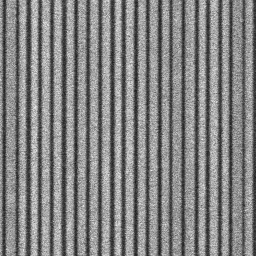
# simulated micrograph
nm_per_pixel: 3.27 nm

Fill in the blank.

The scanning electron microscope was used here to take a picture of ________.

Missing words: parallel lines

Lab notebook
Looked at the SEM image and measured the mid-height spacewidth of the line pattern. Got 12.3 nm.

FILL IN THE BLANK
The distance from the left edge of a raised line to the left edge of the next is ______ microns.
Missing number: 0.0389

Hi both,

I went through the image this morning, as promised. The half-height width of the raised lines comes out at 0.025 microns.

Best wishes